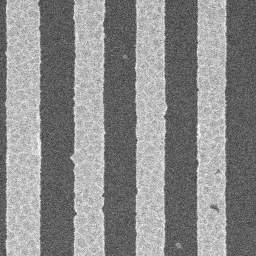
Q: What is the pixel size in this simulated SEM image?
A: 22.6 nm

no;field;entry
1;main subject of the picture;one or a few lines or trenches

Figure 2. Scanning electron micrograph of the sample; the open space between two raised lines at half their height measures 772 nm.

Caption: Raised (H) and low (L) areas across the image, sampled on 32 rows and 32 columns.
LHHHHLLLLHHHHLLLLHHHLLLLLHHHLLLL
LHHHHLLLLHHHHLLLLHHHHLLLLHHHLLLL
LHHHHLLLLHHHHLLLLHHHLLLLLHHHLLLL
LHHHHLLLLHHHHLLLLHHHLLLLLHHHLLLL
LHHHHLLLLHHHHLLLLHHHHLLLLHHHLLLL
LHHHHLLLLHHHHLLLLHHHLLLLLHHHLLLL
LHHHHLLLLLHHHLLLLHHHLLLLLHHHLLLL
LHHHHLLLLHHHHLLLLHHHLLLLLHHHLLLL
LHHHHLLLLHHHHLLLLHHHLLLLLHHHLLLL
LHHHHLLLLHHHHLLLLHHLLLLLLHHHLLLL
LHHHHLLLLHHHHLLLLHHHHLLLLHHHLLLL
LHHHHLLLLHHHHLLLLHHHHLLLLHHHLLLL
LHHHHLLLLHHHHLLLLHHHHLLLLHHHLLLL
LHHHHLLLLHHHHLLLLHHHHLLLLHHHLLLL
LHHHHLLLLHHHHLLLLHHHLLLLLHHHLLLL
LHHHHLLLLHHHHLLLLHHHHLLLLHHHLLLL
LHHHHLLLLHHHHLLLLHHHLLLLLHHHLLLL
LHHHHLLLLHHHHLLLLHHHLLLLLHHHLLLL
LHHHHLLLLHHHHLLLLHHHLLLLLHHHLLLL
LHHHHLLLLHHHHLLLLHHHLLLLLHHHLLLL
LHHHHLLLLHHHHLLLLHHHLLLLLHHHLLLL
LHHHHLLLLHHHHLLLLHHHLLLLLHLLLLLL
LHHHHLLLLHHHHLLLLHHHLLLLLHHHLLLL
LHHHHLLLLHHHHLLLLHHHLLLLLHHHLLLL
LHHHHLLLLHHHHLLLLHHHLLLLLHHHLLLL
LHHHHLLLLHHHHLLLLHHHLLLLLHLHLLLL
LHHHHLLLLLHHHLLLLHHHLLLLLHHLLLLL
LHHHHLLLLHHHHLLLLHHHHLLLLHHHLLLL
LHHHHLLLLHHHHLLLLHHHLLLLLHHHLLLL
LHHHHLLLLHHHHLLLLHHHLLLLLHHHLLLL
LHHHHLLLLHHHHLLLLHHHLLLLLHHHLLLL
LHHHHLLLLHHHHLLLLHHHLLLLLHHHLLLL